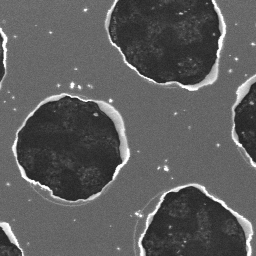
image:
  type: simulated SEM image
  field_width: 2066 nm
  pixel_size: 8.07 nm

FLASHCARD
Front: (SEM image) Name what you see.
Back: holes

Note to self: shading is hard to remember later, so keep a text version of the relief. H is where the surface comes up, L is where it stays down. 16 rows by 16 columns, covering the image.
HHHHHHHLLLLLLHHH
HHHHHHHLLLLLLLHH
HHHHHHHLLLLLLLHH
HHHHHHHHLLLLLLHH
HHHHHHHHHLLLLHHH
HHHHHHHHHHHHHHHL
HHHLLLHHHHHHHHHL
HHLLLLLHHHHHHHHL
HLLLLLLLHHHHHHHL
HLLLLLLLHHHHHHHL
HLLLLLLHHHHHHHHH
HHHLLLLHHHHHHHHH
HHHHLHHHHHLLLHHH
HHHHHHHHHHLLLLLH
HHHHHHHHHLLLLLLL
LHHHHHHHHLLLLLLH